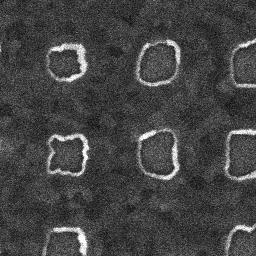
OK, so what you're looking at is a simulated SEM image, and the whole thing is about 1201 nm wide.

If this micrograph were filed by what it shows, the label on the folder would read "holes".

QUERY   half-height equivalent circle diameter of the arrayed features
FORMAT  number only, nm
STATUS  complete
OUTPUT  176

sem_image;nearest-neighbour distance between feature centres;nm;425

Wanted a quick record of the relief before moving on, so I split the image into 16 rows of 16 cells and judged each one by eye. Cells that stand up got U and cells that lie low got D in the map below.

UUUUUUUUUUUUUUUU
UUUUUUUUUUUUUUUU
UUUUUUUUUUUUUUUU
UUUDDUUUUDDUUUUD
UUUDDUUUUDDUUUUD
UUUUUUUUUUUUUUUU
UUUUUUUUUUUUUUUU
UUUUUUUUUUUUUUUU
UUUUUUUUUDDUUUUD
UUUDDUUUUDDUUUDD
UUUDDUUUUDDUUUDD
UUUUUUUUUUUUUUUU
UUUUUUUUUUUUUUUU
UUUUUUUUUUUUUUUU
UUUUUUUUUUUUUUUD
UUUDDUUUUUUUUUDD